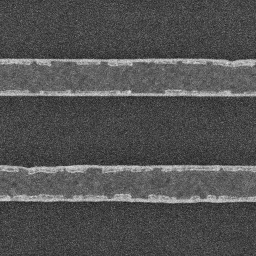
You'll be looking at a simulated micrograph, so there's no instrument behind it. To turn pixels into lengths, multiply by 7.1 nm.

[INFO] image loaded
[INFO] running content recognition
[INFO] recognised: one or a few lines or trenches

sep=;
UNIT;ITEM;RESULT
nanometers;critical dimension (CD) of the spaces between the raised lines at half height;505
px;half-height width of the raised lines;34.7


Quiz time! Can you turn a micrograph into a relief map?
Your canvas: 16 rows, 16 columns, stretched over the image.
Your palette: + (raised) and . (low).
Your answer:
................
................
................
................
++++++++++++++++
++++++++++++++++
................
................
................
................
++++++++++++++++
++++++++++++++++
++++++++++++++++
................
................
................